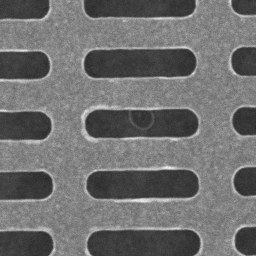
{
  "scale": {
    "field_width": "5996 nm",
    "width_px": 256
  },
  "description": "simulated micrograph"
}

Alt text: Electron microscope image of holes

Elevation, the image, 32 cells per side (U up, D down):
DDDDDDUUUUDDDDDDDDDDDDDDDUUUUDDD
DDDDDDUUUUUDDDDDDDDDDDDDUUUUUDDD
UUUUUUUUUUUUUUUUUUUUUUUUUUUUUUUU
UUUUUUUUUUUUUUUUUUUUUUUUUUUUUUUU
UUUUUUUUUUUUUUUUUUUUUUUUUUUUUUUU
UUUUUUUUUUUUUUUUUUUUUUUUUUUUUUUU
DDDDDUUUUUUDDDDDDDDDDDDDUUUUUDDD
DDDDDDUUUUDDDDDDDDDDDDDDDUUUUDDD
DDDDDDUUUUDDDDDDDDDDDDDDUUUUUDDD
DDDDDDUUUUUDDDDDDDDDDDDUUUUUUUDD
UUUUUUUUUUUUUUUUUUUUUUUUUUUUUUUU
UUUUUUUUUUUUUUUUUUUUUUUUUUUUUUUU
UUUUUUUUUUUUUUUUUUUUUUUUUUUUUUUU
UUUUUUUUUUUUUUUUUUUUUUUUUUUUUUDD
DDDDDDUUUUUDDDDDDDDDDDDDDUUUUDDD
DDDDDDUUUUUDDDDDDDDDDDDDDUUUUDDD
DDDDDDUUUUUDDDDDDDDDDDDDUUUUUUDD
DDDDDUUUUUUUUUUUUUUUUUUUUUUUUUUU
UUUUUUUUUUUUUUUUUUUUUUUUUUUUUUUU
UUUUUUUUUUUUUUUUUUUUUUUUUUUUUUUU
UUUUUUUUUUUUUUUUUUUUUUUUUUUUUUUU
DDDDDDUUUUUUDDDDDDDDDDDDUUUUUUDD
DDDDDDUUUUUDDDDDDDDDDDDDDUUUUDDD
DDDDDDDUUUUDDDDDDDDDDDDDDUUUUDDD
DDDDDDUUUUUDDDDDDDDDDDDDUUUUUUDD
UUUUUUUUUUUUUUUUUUUUUUUUUUUUUUUU
UUUUUUUUUUUUUUUUUUUUUUUUUUUUUUUU
UUUUUUUUUUUUUUUUUUUUUUUUUUUUUUUU
UUUUUUUUUUUUUUUUUUUUUUUUUUUUUUDD
DDDDDDUUUUUDDDDDDDDDDDDDDUUUUDDD
DDDDDDDUUUUDDDDDDDDDDDDDDUUUUDDD
DDDDDDDUUUUDDDDDDDDDDDDDDUUUUUDD